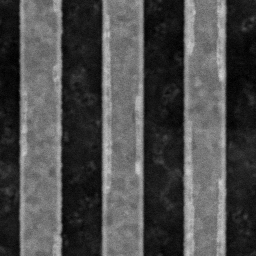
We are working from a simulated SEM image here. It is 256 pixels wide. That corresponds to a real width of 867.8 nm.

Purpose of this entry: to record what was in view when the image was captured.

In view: one or a few lines or trenches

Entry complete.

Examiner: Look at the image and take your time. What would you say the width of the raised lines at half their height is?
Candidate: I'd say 134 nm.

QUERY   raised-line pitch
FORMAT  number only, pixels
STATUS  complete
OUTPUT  82.2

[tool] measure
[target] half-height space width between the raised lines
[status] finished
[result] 145 nanometres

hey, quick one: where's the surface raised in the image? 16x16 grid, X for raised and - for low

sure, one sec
-XXX---XX---XX--
-XXX---XX---XX--
-XXX---XX---XX--
-XXX---XX---XX--
-XXX---XX---XX--
-XXX--XXX---XX--
-XXX--XXX---XX--
-XXX--XXX---XX--
-XXX--XXX---XX--
-XXX--XXX---XX--
-XXX--XXX---XX--
-XXX--XXX---XX--
-XXX--XXX---XX--
-XXX--XXX---XX--
-XXX--XXX---XX--
-XXX--XXX---XX--